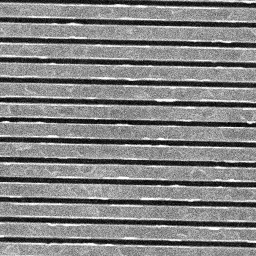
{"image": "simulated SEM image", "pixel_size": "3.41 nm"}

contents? parallel lines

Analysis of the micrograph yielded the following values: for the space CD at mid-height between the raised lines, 18.3 nanometres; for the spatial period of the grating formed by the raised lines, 68 nanometres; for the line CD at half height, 51.1 nanometers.